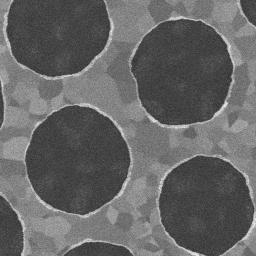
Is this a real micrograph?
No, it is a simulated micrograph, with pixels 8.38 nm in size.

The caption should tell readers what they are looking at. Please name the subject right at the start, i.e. holes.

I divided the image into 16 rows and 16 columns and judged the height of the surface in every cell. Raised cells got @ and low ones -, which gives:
@------@@@@@@@@-
-------@@@---@@@
@------@@-----@@
@-----@@------@@
@@---@@@-------@
@@@@@@@@@-----@@
@@@@@@@@@-----@@
@@@----@@@---@@@
@@------@@@@@@@@
@@------@@@@@@@@
@@------@@@----@
@@------@@-----@
@@@----@@@------
-@@@@@@@@@------
-@@@@@@@@@------
-@@@@---@@@---@@